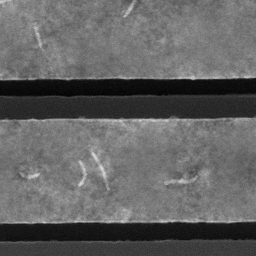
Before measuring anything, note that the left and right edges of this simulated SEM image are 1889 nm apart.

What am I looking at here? lines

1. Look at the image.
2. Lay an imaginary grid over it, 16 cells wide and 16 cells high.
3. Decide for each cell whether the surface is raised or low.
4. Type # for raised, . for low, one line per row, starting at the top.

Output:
################
################
################
################
################
................
................
################
################
################
################
################
################
################
................
................